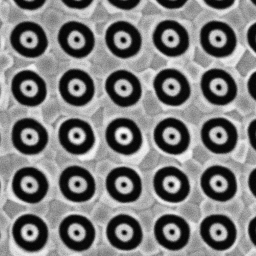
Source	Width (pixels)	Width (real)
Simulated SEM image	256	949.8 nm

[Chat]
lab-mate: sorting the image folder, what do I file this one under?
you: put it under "a regular array of ring-shaped grooves with a dot in the middle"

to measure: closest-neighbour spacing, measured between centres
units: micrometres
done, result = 0.174